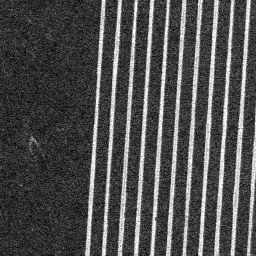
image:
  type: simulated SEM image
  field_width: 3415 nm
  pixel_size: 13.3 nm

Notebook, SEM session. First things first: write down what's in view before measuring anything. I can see parallel lines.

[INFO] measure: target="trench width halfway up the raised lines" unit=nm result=183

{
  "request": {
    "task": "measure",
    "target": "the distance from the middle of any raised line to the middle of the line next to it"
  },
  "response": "16.1 pixels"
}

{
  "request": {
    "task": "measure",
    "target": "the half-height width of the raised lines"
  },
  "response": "39.9 nm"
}